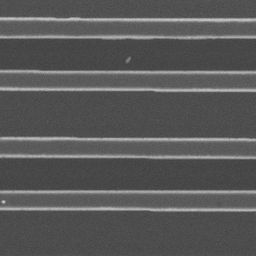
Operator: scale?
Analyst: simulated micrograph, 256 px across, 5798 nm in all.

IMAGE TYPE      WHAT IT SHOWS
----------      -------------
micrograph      lines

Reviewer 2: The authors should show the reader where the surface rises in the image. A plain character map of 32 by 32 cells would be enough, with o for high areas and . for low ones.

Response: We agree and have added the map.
................................
................................
ooooooooooooooooooooooooo.......
oooooooooooooooooooooooooooooooo
oooooooooooooooooooooooooooooooo
................................
................................
................................
................................
oooooooooooooooooooooooooooooooo
oooooooooooooooooooooooooooooooo
................................
................................
................................
................................
................................
................................
oooooooooooooooooooooooooooooooo
oooooooooooooooooooooooooooooooo
oooooooooooooooooooooooooooooooo
................................
................................
................................
................................
oooooooooooooooooooooooooooooooo
oooooooooooooooooooooooooooooooo
................................
................................
................................
................................
................................
................................